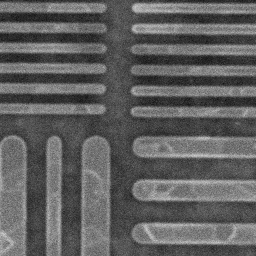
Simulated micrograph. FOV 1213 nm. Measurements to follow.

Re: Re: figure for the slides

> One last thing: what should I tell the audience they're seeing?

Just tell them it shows groups of lines, slits or small figures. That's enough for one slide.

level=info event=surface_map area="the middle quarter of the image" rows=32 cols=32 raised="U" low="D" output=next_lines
UUUUUUUUUUDDDDDDDDUUUUUUUUUUUUDD
UUUUUUUUUUDDDDDDDUUUUUUUUUUUUUUU
DDDDDDDDDDDDDDDDDDUUUUUUUUUUUUUU
DDDDDDDDDDDDDDDDDDDDDDDDDDDDDDDD
DDDDDDDDDDDDDDDDDDDDDDDDDDDDDDDD
UUUUUUUUUUDDDDDDDDDDDDDDDDDDDDDD
UUUUUUUUUUDDDDDDDUUUUUUUUUUUUUUU
DDDDDDDDDDDDDDDDDDUUUUUUUUUUUUUU
DDDDDDDDDDDDDDDDDDDDDDDDDDDDDDDD
DDDDDDDDDDDDDDDDDDDDDDDDDDDDDDDD
UUUUUUUUUUDDDDDDDDDDDDDDDDDDDDDD
UUUUUUUUUUDDDDDDDUUUUUUUUUUUUUUU
DDDDDDDDDDDDDDDDDUUUUUUUUUUUUUUU
DDDDDDDDDDDDDDDDDDDDDDDDDDDDDDDD
DDDDDDDDDDDDDDDDDDDDDDDDDDDDDDDD
DDDDDDDDDDDDDDDDDDDDDDDDDDDDDDDD
DDDDDDDDDDDDDDDDDDDDDDDDDDDDDDDD
DDDDDDDDDDDDDDDDDDDDDDDDDDDDDDDD
DDDDDDUUUDDDDDDDDDDUUUUUUUUUUUUU
DDDDDUUUUUUDDDDDDDUUUUUUUUUUUUUU
DDDDDUUUUUUDDDDDDUUUUUUUUUUUUUUU
DDDDDUUUUUUDDDDDDUUUUUUUUUUUUUUU
DDDDDUUUUUUDDDDDDDUUUUUUUUUUUUUU
DDDDDUUUUUUDDDDDDDDDDDDDDDDDDDDD
DDDDDUUUUUUDDDDDDDDDDDDDDDDDDDDD
DDDDDUUUUUUDDDDDDDDDDDDDDDDDDDDD
DDDDDUUUUUUDDDDDDDDDDDDDDDDDDDDD
DDDDDUUUUUUDDDDDDDDDDDDDDDDDDDDD
DDDDDUUUUUUDDDDDDDDDDDDDDDDDDDDD
DDDDDUUUUUUDDDDDDDUUUUUUUUUUUUUU
DDDDDUUUUUUDDDDDDUUUUUUUUUUUUUUU
DDDDDUUUUUUDDDDDDUUUUUUUUUUUUUUU